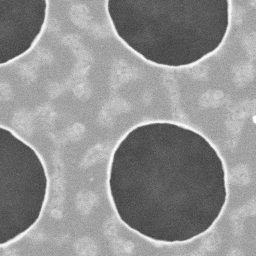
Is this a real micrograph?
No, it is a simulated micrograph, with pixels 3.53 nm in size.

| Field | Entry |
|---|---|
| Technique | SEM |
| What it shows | holes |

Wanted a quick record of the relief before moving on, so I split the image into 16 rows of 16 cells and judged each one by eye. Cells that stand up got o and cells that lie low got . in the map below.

...oooo.......oo
...oooo.......oo
..oooooo......oo
.oooooooo....ooo
oooooooooooooooo
oooooooooooooooo
oooooooooooooooo
oooooooooooooooo
.ooooooo.....ooo
..ooooo......ooo
...oooo.......oo
...oooo.......oo
...oooo.......oo
..ooooo.......oo
..ooooooo....ooo
oooooooooooooooo